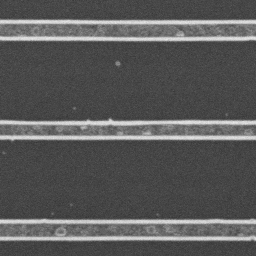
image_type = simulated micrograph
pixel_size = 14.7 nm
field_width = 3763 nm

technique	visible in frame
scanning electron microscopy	one or a few lines or trenches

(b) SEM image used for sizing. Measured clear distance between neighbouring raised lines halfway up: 1230 nanometres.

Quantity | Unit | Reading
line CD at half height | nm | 248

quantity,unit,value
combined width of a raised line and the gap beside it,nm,1470